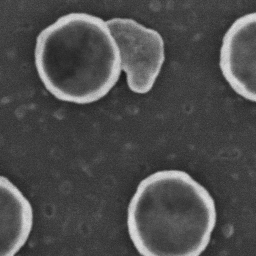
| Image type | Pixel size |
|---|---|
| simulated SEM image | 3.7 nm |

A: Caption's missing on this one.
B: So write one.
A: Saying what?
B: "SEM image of raised bodies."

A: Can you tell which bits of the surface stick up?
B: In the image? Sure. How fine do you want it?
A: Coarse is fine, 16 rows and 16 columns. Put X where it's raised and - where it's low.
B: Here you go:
----------------
----XX---------X
---XXXX-------XX
--XXXXX-------XX
---XXXX-------XX
---XXXX--------X
----------------
----------------
----------------
----------------
----------------
---------XXX----
X-------XXXXX---
XX------XXXXX---
XX------XXXXX---
X--------XXXX---